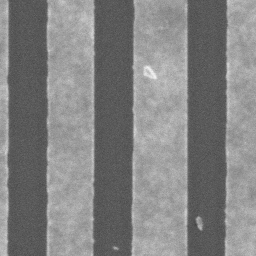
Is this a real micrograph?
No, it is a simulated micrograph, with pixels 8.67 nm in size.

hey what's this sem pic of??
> lines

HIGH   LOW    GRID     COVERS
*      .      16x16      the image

...***..****..**
...***..****..**
...***..****..**
...***..****..**
...***..****..**
...***..****..**
...***..****..**
...***..****..**
...***..****..**
...***..****..**
...***..****..**
...***..****..**
...***..****..**
...***..****..**
...***..****..**
...***..****..**